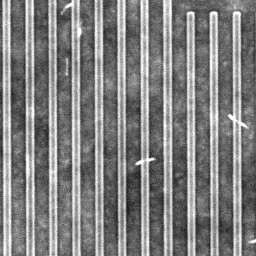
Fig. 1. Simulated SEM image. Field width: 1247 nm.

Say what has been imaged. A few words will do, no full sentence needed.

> parallel lines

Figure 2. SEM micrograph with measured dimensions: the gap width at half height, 77.9 nm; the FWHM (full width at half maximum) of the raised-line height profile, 0.0322 micrometres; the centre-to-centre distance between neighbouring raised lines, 112 nm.